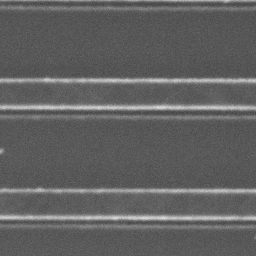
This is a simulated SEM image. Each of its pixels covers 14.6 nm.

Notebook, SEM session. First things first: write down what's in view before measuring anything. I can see lines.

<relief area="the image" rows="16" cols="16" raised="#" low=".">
................
................
................
................
................
################
################
................
................
................
................
................
################
################
................
................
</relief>